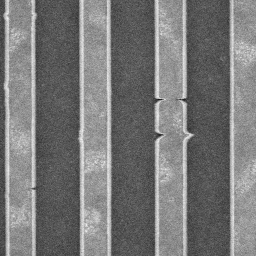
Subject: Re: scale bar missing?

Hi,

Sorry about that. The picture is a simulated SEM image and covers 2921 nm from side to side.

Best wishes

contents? one or a few lines or trenches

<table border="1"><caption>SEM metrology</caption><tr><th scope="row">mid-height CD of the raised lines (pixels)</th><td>28.1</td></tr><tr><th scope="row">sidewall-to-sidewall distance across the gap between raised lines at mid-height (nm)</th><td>536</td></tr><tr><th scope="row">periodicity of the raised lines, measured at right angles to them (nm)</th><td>859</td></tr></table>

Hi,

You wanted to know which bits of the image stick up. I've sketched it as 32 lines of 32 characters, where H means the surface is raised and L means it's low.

LHHHLLLLLLHHHHLLLLLLHHHLLLLLLHHH
LHHHLLLLLLHHHHLLLLLLHHHLLLLLLHHH
LHHHLLLLLLHHHHLLLLLLHHHLLLLLLHHH
LHHHLLLLLLHHHHLLLLLLHHHLLLLLLHHH
LHHHLLLLLLHHHHLLLLLLHHHLLLLLLHHH
LHHHLLLLLLHHHHLLLLLLHHHLLLLLLHHH
LHHHLLLLLLHHHHLLLLLLHHHLLLLLLHHH
LHHHLLLLLLHHHHLLLLLLHHHLLLLLLHHH
LHHHLLLLLLHHHHLLLLLLHHHLLLLLLHHH
LHHHLLLLLLHHHHLLLLLLHHHLLLLLLHHH
LHHHLLLLLLHHHHLLLLLLHHHLLLLLLHHH
LHHHLLLLLLHHHHLLLLLLHHHLLLLLLHHH
LHHHLLLLLLHHHHLLLLLLHHHLLLLLLHHH
LHHHLLLLLLHHHHLLLLLLHHHLLLLLLHHH
LHHHLLLLLLHHHHLLLLLLHHHLLLLLLHHH
LHHHLLLLLLHHHHLLLLLLHHHLLLLLLHHH
LHHHLLLLLLHHHHLLLLLLHHHLLLLLLHHH
LHHHLLLLLLHHHHLLLLLLHHHLLLLLLHHH
LHHHLLLLLLHHHHLLLLLLHHHLLLLLLHHH
LHHHLLLLLLHHHHLLLLLLHHHLLLLLLHHH
LHHHLLLLLLHHHHLLLLLLHHHLLLLLLHHH
LHHHLLLLLLHHHHLLLLLLHHHLLLLLLHHH
LHHHLLLLLLHHHHLLLLLLHHHLLLLLLHHH
LHHHLLLLLLHHHHLLLLLLHHHLLLLLLHHH
LHHHLLLLLLHHHHLLLLLLHHHLLLLLLHHH
LHHHLLLLLLHHHHLLLLLLHHHLLLLLLHHH
LHHHLLLLLLHHHHLLLLLLHHHLLLLLLHHH
LHHHLLLLLLHHHHLLLLLLHHHLLLLLLHHH
LHHHLLLLLLHHHHLLLLLLHHHLLLLLLHHH
LHHHLLLLLLHHHHLLLLLLHHHLLLLLLHHH
LHHHLLLLLLHHHHLLLLLLHHHLLLLLLHHH
LHHHLLLLLLHHHHLLLLLLHHHLLLLLLHHH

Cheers